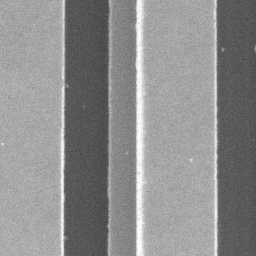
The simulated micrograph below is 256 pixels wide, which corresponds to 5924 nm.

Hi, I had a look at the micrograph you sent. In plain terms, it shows lines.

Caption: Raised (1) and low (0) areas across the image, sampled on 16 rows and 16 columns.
1111000111111100
1111000111111100
1111000111111100
1111000111111100
1111000111111100
1111000111111100
1111000111111100
1111000111111100
1111000111111100
1111000111111100
1111000111111100
1111000111111100
1111000111111100
1111000111111100
1111000111111100
1111000111111100